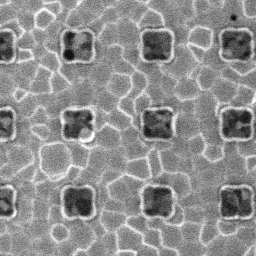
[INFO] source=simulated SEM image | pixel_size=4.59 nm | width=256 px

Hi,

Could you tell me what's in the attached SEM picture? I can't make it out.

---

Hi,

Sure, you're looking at a regular array of raised bodies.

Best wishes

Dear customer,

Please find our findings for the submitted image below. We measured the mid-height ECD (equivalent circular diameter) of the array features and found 35.6 px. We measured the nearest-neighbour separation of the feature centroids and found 359 nm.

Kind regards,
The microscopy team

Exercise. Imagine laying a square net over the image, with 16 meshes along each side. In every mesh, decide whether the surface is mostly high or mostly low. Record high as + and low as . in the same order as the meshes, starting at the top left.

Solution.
................
................
+...++...++...++
+...++...++...++
................
................
................
+...++...++...++
+...++...++...++
................
................
................
+...++...++....+
+...++...++....+
................
................